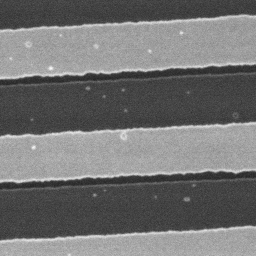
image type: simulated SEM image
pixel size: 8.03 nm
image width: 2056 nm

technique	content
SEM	lines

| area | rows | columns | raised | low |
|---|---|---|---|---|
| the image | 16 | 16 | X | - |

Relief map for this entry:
----------------
------XXXXXXXXXX
XXXXXXXXXXXXXXXX
XXXXXXXXXXXXXXXX
XXXXXXX---------
----------------
----------------
----------------
XXXXXXXXXXXXXXXX
XXXXXXXXXXXXXXXX
XXXXXXXXXXXXXXXX
----------------
----------------
----------------
----------XXXXXX
XXXXXXXXXXXXXXXX